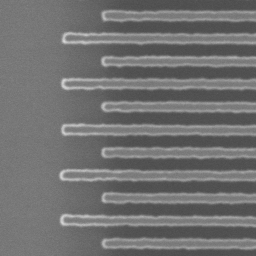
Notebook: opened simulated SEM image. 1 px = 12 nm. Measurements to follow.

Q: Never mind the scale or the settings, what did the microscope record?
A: parallel lines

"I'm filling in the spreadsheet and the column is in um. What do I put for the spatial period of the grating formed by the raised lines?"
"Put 0.273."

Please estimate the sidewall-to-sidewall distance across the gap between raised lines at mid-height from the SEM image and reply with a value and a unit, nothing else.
0.165 um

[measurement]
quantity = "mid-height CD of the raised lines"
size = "9.12 pixels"